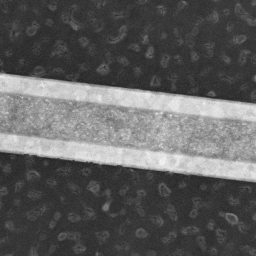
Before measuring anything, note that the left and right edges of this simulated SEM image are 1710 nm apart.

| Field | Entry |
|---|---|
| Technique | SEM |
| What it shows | one or a few lines or trenches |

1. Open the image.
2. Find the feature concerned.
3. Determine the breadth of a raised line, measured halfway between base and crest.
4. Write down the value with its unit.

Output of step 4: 60.4 pixels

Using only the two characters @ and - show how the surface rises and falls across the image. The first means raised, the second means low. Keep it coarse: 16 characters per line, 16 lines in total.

----------------
----------------
----------------
----------------
----------------
@@@-------------
@@@@@@@@@@@@----
@@@@@@@@@@@@@@@@
@@@@@@@@@@@@@@@@
-----@@@@@@@@@@@
-------------@@@
----------------
----------------
----------------
----------------
----------------